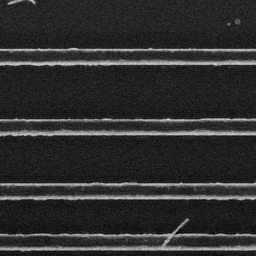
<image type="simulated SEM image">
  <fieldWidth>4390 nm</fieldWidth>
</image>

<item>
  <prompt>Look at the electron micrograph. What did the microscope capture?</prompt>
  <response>lines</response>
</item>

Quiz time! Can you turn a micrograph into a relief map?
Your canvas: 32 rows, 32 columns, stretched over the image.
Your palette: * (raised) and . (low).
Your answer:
................................
................................
................................
................................
................................
................................
********************************
********************************
................................
................................
................................
................................
................................
................................
................................
********************************
********************************
................................
................................
................................
................................
................................
................................
********************************
********************************
................................
................................
................................
................................
********************************
********************************
................................